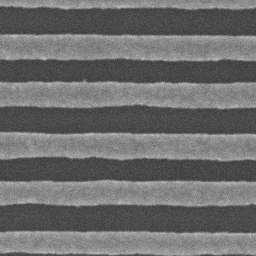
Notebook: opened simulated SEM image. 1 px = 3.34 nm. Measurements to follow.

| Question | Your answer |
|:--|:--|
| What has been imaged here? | lines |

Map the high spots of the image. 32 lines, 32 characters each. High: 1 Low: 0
11111111111111111111111111111111
00000000000000000000000000000000
00000000000000000000000000000000
00000000000000000000000000000000
11111111111110010000000000000000
11111111111111111111111111111111
11111111111111111111111111111111
00000000000000000000111111100011
00000000000000000000000000000000
00000000000000000000000000000000
11111111111111111001111100000111
11111111111111111111111111111111
11111111111111111111111111111111
00000000000000000000000000000000
00000000000000000000000000000000
00000000000000000000000000000000
00000000000000000000000000000000
11111111111111111111111111111111
11111111111111111111111111111111
11111111111111111111111111111111
00000000000000000000000000000000
00000000000000000000000000000000
00000000000000000000000000000000
11111111111111111111111111111111
11111111111111111111111111111111
11000111111111111111111111111111
00000000000000000000000000000000
00000000000000000000000000000000
00000000000000000000000000000000
11111111111111111111111111111111
11111111111111111111111111111111
10011111111111111111111111111111